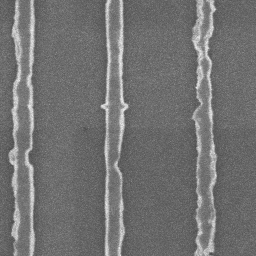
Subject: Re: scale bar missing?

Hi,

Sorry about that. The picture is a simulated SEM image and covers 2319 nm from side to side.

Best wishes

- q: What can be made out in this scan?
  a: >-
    one or a few lines or trenches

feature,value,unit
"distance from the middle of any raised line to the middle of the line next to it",821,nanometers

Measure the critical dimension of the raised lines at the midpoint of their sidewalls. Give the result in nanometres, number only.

131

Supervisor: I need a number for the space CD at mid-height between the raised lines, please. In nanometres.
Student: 688